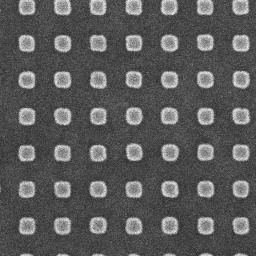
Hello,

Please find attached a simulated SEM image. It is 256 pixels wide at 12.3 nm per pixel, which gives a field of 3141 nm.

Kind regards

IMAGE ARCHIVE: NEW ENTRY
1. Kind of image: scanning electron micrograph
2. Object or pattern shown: a regular array of raised bodies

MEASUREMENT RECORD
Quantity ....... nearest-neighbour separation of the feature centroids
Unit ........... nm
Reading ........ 436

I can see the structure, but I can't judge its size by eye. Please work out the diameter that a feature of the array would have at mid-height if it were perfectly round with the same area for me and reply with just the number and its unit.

0.199 microns